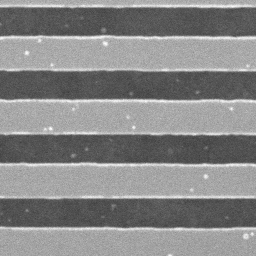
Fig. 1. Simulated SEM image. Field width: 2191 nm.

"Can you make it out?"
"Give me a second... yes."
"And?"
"lines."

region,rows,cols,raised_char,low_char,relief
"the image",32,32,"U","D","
UUUUUUUUUUUUUUUUUUUUUUUUUUUUUUUU
DDDDDDDDDDDDDDDDDDDDDDDDDDDDDDDD
DDDDDDDDDDDDDDDDDDDDDDDDDDDDDDDD
DDDDDDDDDDDDDDDDDDDDDDDDDDDDDDDD
DDDDDDDDDDDDDDDDDDDDDDDDDDDDDDDD
UUUUUUUUUUUUUUUUUUUUUUUUUUUUUUUU
UUUUUUUUUUUUUUUUUUUUUUUUUUUUUUUU
UUUUUUUUUUUUUUUUUUUUUUUUUUUUUUUU
UUUUUUUUUUUUUUUUUUUUUUUUUUUUUUUU
DDDDDDDDDDDDDDDDDDDDDDDDDDDDDDDD
DDDDDDDDDDDDDDDDDDDDDDDDDDDDDDDD
DDDDDDDDDDDDDDDDDDDDDDDDDDDDDDDD
DDDDDDDDDDDDDDDDDDDDDDDDDDDDDDDD
UUUUUUUUUUUUUUUUUUUUUUUUUUUUUUUU
UUUUUUUUUUUUUUUUUUUUUUUUUUUUUUUU
UUUUUUUUUUUUUUUUUUUUUUUUUUUUUUUU
UUUUUUUUUUUUUUUUUUUUUUUUUUUUUUUU
DDDDDDDDDDDDDDDDDDDDDDDDDDDDDDDD
DDDDDDDDDDDDDDDDDDDDDDDDDDDDDDDD
DDDDDDDDDDDDDDDDDDDDDDDDDDDDDDDD
DDUUDDDDDDUUDDDDDDDDDDDDDDDDDDDD
UUUUUUUUUUUUUUUUUUUUUUUUUUUUUUUU
UUUUUUUUUUUUUUUUUUUUUUUUUUUUUUUU
UUUUUUUUUUUUUUUUUUUUUUUUUUUUUUUU
UUUUUUUUUUUUUUUUUUUUUUUUUUUUUUUU
DDDDDDDDDDDDDDDDDDDDDDDDDDDDDDDD
DDDDDDDDDDDDDDDDDDDDDDDDDDDDDDDD
DDDDDDDDDDDDDDDDDDDDDDDDDDDDDDDD
UDDDDDDDDDDDDDDDDDDDDDDDDDDDDDDD
UUUUUUUUUUUUUUUUUUUUUUUUUUUUUUUU
UUUUUUUUUUUUUUUUUUUUUUUUUUUUUUUU
UUUUUUUUUUUUUUUUUUUUUUUUUUUUUUUU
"